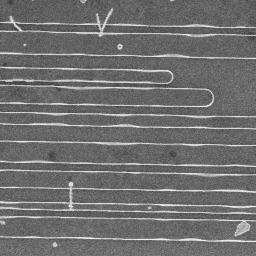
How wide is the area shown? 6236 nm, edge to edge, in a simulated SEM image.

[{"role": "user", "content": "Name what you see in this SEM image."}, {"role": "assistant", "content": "groups of lines, slits or small figures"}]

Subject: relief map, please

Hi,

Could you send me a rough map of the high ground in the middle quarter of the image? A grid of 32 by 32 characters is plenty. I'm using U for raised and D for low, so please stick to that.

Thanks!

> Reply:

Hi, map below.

DDDDDDDDDDDDDDDDDDDDDDDDDDDDDDDD
UUUUUUUUUUUUUUUUDDDDDDDDDDDDDDDD
UUUUUUUUUUUUUUUUUUUUUUUUUUUDDDDD
UUUUUUUUUUUUUUUUUUUUUUUUUUUDDDDD
DDDDDDDDDDDDDDDDDDDDDUUUUUUDDDDD
DDDDDDDDDDDDDDDDDDDDDDDDDDDDDDDD
UUUUUUUUUUUUUUUUUUUUUUUUUUUUUUUU
UUUUUUUUUUUUUUUUUUUUUUUUUUUUUUUU
UUUUUUUUUUUUUUUUUUUUUUUUUUUUUUUU
UUUUUUUUUUUUUUUUUUUUUUUUUUUUUUUU
DDDDDDDDDDDDDDDDDDDDDDDDDUUUUUUU
DDDDDDDDDDDDDDDDDDDDDDDDDDDDDDDD
DDDDDDDDDDDDDDDDDDDDDDDDDDDDDDDD
UUUUUUUUUUUUUUUUUUUUUUUUUUUUUUUU
UUUUUUUUUUUUUUUUUUUUUUUUUUUUUUUU
DDDDDDDDDDDDDDDDDUUUUUUUUUUUUUUU
DDDDDDDDDDDDDDDDDDDDDDDDDDDDDDDD
DDDDDDDDDDDDDDDDDDDDDDDDDDDDDDDD
DDDDDDDDDDDDDDDDDDDDDDDDDDDDDDDD
DDDDDDDDDDDDDDDDDDDDDDDDDDDDDDDD
UUUUUUUUUUUUUUUUUUUUUUUUUUUUUUUU
UUUUUUUUUUUUUUUUUUUUUUUUUUUUUUUU
UUUUUUUUUUUUUUUUUUUUUUUUUUUUUUUU
UUUUUUUUUUUUUUUUUUUUUUUUUUUUUUUU
UUUUUUUUUUUUUUUUUUUUUUUUUUUUUUUU
DDDDDDDDDDDDDDDDDDDDDDDDDDDDDDDD
DDDDDDDDDDDDDDDDDDDDDDDDDDDDDDDD
UUUUUUUUUUUUUUUUUUUUUUUUUUUUUUDD
UUUUUUUUUUUUUUUUUUUUUUUUUUUUUUUU
UUUUUUUUUUUUUUUUUUUUUUUUUUUUUUUU
UUUUUUUUUUUUUUUUUUUUUUUUUUUUUUUU
DUDDDDDDDDDDDDDDDDDDDDDDDDDDUUUU